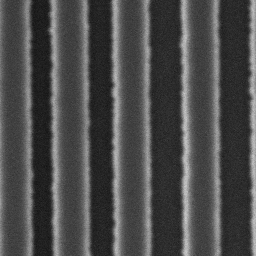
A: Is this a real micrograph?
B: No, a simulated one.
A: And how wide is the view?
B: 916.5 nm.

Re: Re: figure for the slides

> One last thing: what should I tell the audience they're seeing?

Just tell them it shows lines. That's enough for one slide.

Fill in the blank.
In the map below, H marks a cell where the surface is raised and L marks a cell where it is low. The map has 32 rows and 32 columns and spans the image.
HHHHLLHHHHHLLLHHHHHLLLLHHHHLLLLH
HHHHLLHHHHHLLLHHHHLLLLLHHHHLLLLH
HHHHLLLHHHHLLLHHHHHLLLLHHHHLLLLL
HHHHLLHHHHHLLLHHHHHLLLLHHHHLLLLL
HHHHLLLHHHHLLLHHHHHLLLLHHHHLLLLH
HHHHLLLHHHHLLLHHHHHLLLLHHHHLLLLH
HHHHLLLHHHHLLLHHHHHLLLLHHHHLLLLL
HHHHLLLHHHHLLLHHHHHLLLLHHHHLLLLH
HHHHLLLHHHHLLLHHHHHLLLLHHHHLLLLL
HHHHLLLHHHHLLLHHHHHLLLLHHHHLLLLL
HHHHLLLHHHHLLLHHHHHLLLLHHHHLLLLH
HHHHLLLHHHHLLLHHHHHLLLLHHHHLLLLH
HHHHLLHHHHHLLLHHHHHLLLLHHHHLLLLL
HHHHLLLHHHHLLLHHHHHLLLLHHHHLLLLL
HHHHLLLHHHHLLLHHHHHLLLLHHHHLLLLL
HHHHLLLHHHHLLLHHHHHLLLLHHHHLLLLL
HHHHLLLHHHHLLLHHHHHLLLLHHHHLLLLL
HHHHLLLHHHHLLLHHHHHLLLLHHHHLLLLL
HHHHLLLHHHHLLLHHHHHLLLLHHHHLLLLL
HHHHLLLHHHHLLLHHHHHLLLLHHHHLLLLL
HHHHLLLHHHHLLLHHHHHLLLLHHHHLLLLL
HHHHLLLHHHHLLLHHHHHLLLLHHHHLLLLL
HHHHLLLHHHHLLLHHHHHLLLLHHHHLLLLL
HHHHLLLHHHHLLLHHHHHLLLLHHHHLLLLL
HHHHLLLHHHHLLLHHHHHLLLLHHHHLLLLL
HHHHLLLHHHHLLLHHHHHLLLLHHHHLLLLL
HHHHLLLHHHHLLLHHHHHLLLLHHHHLLLLL
HHHHLLLHHHHLLLHHHHHLLLLHHHHLLLLL
HHHHLLLHHHHLLLHHHHHLLLLHHHHLLLLL
HHHHLLLHHHHLLLHHHHHLLLLHHHHLLLLL
HHHHLLLHHHHLLLHHHHHLLLLHHHHLLLLL
HHHHLLLHHHHLLLHHHHHLLLLHHHHLLLLL